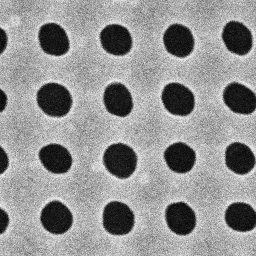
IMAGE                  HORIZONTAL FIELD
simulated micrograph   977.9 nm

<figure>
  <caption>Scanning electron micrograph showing a regular array of holes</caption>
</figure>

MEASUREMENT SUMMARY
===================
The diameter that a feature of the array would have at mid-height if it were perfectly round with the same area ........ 0.125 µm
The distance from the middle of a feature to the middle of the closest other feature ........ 224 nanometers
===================